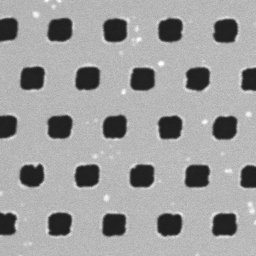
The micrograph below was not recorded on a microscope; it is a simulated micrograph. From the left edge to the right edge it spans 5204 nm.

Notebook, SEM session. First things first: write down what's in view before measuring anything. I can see a regular array of holes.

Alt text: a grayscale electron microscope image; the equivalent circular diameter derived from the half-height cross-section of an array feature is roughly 524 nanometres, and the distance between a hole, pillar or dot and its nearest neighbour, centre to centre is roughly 55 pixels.